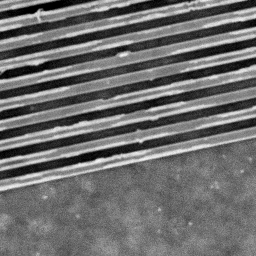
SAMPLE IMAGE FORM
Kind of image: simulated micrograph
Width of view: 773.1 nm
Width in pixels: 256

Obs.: parallel lines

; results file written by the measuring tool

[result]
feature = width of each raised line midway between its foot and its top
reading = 28.8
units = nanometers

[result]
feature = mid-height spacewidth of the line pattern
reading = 28.5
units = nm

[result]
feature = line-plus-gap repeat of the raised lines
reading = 0.0588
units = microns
